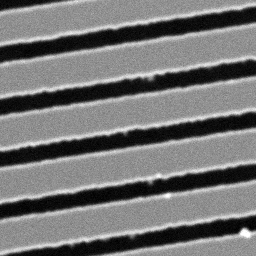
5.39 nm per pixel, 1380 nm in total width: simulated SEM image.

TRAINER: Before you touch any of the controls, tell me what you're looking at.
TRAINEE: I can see lines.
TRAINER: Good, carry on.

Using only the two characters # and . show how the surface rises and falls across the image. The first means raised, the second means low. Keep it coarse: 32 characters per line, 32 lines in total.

......##########################
###########################.....
####################............
###############.............####
########..............##########
#..............#################
.........#######################
...############################.
########################........
##################..............
############..............######
#####...............############
.............###################
......##########################
.###########################....
######################..........
###############..............###
########...............#########
##..............################
..........######################
....###########################.
#########################.......
##################..............
############..............######
######..............############
.............###################
.......#########################
###########################.....
#####################...........
##############...............###
########..............##########
##..............################